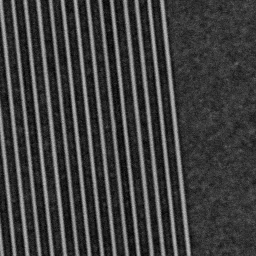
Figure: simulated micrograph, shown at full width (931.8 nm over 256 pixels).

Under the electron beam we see parallel lines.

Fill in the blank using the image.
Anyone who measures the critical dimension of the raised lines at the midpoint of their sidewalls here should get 10.9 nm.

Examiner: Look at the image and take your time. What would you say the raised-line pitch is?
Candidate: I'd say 45.2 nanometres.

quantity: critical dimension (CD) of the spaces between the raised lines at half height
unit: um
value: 0.0322